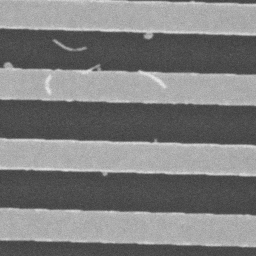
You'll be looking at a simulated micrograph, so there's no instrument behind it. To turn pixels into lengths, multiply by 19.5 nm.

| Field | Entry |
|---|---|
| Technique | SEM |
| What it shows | lines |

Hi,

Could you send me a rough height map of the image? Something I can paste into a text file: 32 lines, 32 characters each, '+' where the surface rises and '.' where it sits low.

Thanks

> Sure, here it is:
++++++++++++++++++++++++++++++..
++++++++++++++++++++++++++++++++
++++++++++++++++++++++++++++++++
++++++++++++++++++++++++++++++++
................................
................................
................................
................................
................................
++++++++++++++++++++++++++++++++
++++++++++++++++++++++++++++++++
++++++++++++++++++++++++++++++++
........+.++++++++++++++++++++++
................................
................................
................................
................................
++++++..........................
++++++++++++++++++++++++++++++++
++++++++++++++++++++++++++++++++
++++++++++++++++++++++++++++++++
.................+++++++++++++++
................................
................................
................................
................................
+++++++++++++++.................
++++++++++++++++++++++++++++++++
++++++++++++++++++++++++++++++++
++++++++++++++++++++++++++++++++
.....................+++++++++++
................................